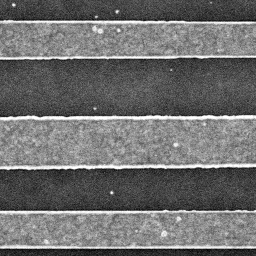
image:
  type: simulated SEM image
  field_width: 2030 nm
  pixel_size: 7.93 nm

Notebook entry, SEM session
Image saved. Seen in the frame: lines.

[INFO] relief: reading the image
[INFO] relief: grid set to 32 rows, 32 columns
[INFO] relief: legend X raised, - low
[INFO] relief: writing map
--------------------------------
--------------------------------
--------------------------------
XXXXXXXXXXXXXXXXXXXXXXXXXXXXXXXX
XXXXXXXXXXXXXXXXXXXXXXXXXXXXXXXX
XXXXXXXXXXXXXXXXXXXXXXXXXXXXXXXX
XXXXXXXXXXXXXXXXXXXXXXXXXXXXXXXX
--------------------------------
--------------------------------
--------------------------------
--------------------------------
--------------------------------
--------------------------------
--------------------------------
--------------------------------
XXXXXXXXXXXXXXXXXXXXXXXXXXXXXXXX
XXXXXXXXXXXXXXXXXXXXXXXXXXXXXXXX
XXXXXXXXXXXXXXXXXXXXXXXXXXXXXXXX
XXXXXXXXXXXXXXXXXXXXXXXXXXXXXXXX
XXXXXXXXXXXXXXXXXXXXXXXXXXXXXXXX
XXXXXXXXXXXXXXXXXXXXXXXXXXXXXXXX
--------------------------------
--------------------------------
--------------------------------
--------------------------------
--------------------------------
XXXXXXXXXXXXXXXXXXXXXXXXXXXXXXXX
XXXXXXXXXXXXXXXXXXXXXXXXXXXXXXXX
XXXXXXXXXXXXXXXXXXXXXXXXXXXXXXXX
XXXXXXXXXXXXXXXXXXXXXXXXXXXXXXXX
XXXXXXXXXXXXXXXXXXXXXXXXXXXXXXXX
--------------------------------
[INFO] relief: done